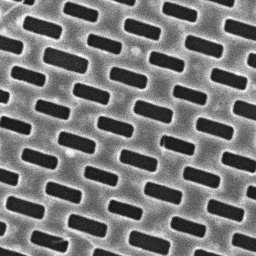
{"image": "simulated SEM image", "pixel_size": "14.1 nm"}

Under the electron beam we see a regular array of holes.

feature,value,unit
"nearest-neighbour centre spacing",575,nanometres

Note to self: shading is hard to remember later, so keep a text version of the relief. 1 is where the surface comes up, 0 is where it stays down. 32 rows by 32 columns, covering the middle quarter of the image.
00000011111111111111111000000011
00000011111100001111111111100011
11110111111000000001111111111111
11111111111000000000011111111111
11111111111110000000011111111111
11000011111111110000011111110011
11000000001111111111111111100000
11000000000011111111111111100000
11110000000011111111111111110000
11111110000111111100011111111111
11111111111111111000000011111111
00111111111111111000000000011111
01111111111111111100000000011111
01111111100111111111100000011111
11111111000000011111111100011111
11111111000000000111111111111111
11111111100000000011111111111111
00111111111110000111111111111111
00000011111111111111111100000111
00000000111111111111111100000001
00000000111111111111111100000000
11100000111111100111111111000000
11111101111111000001111111111100
11111111111111000000000111111111
11111111111111000000000011111111
11111101111111111000000111111111
11111000001111111111000111111100
11111000000001111111111111111100
11111000000000111111111111111100
11111111100001111111101111111111
01111111111001111111000001111111
00001111111111111111000000001111